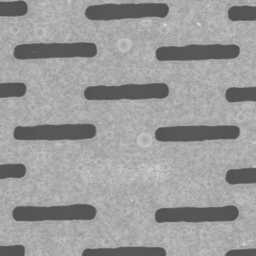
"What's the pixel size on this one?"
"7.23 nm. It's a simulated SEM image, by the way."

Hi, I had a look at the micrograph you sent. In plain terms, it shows a regular array of holes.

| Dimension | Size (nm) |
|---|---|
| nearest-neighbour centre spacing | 583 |